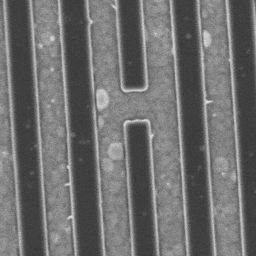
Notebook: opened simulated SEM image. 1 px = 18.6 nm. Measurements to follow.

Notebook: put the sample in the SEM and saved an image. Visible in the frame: parallel lines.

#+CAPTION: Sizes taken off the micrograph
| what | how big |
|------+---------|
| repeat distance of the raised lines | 55.6 px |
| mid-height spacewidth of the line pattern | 514 nm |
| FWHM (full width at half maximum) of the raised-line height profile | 27.6 px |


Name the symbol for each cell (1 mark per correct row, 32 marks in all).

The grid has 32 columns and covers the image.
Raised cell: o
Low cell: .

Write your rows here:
oooo...oooo...oooo...oooo...oooo
.ooo...oooo...oooo...oooo...oooo
.ooo....ooo....ooo....ooo....ooo
.ooo....ooo....ooo....ooo....ooo
.ooo....ooo....ooo....oooo...ooo
.ooo....ooo....ooo....oooo...ooo
.ooo....ooo....ooo....ooo....ooo
.ooo....ooo....ooo....ooo....ooo
.ooo....oooo...ooo....ooo....ooo
.ooo....oooo...ooo....ooo....ooo
.oooo...oooo...ooo....oooo...ooo
.oooo...oooo..........oooo...ooo
.oooo...ooooo.........oooo...ooo
.oooo...oooo..........oooo...ooo
.oooo...oooo..........oooo...ooo
.oooo...oooo....ooo...oooo...ooo
.oooo...oooo....ooo...oooo...ooo
..ooo....ooo....ooo....ooo....oo
..ooo....ooo..ooooo....ooo....oo
..ooo....ooo..o.ooo....ooo....oo
..ooo....ooo....ooo....ooo.o..oo
..ooo....ooo....ooo....ooo....oo
..ooo....ooo....ooo....ooo....oo
..ooo....oooo...ooo....ooo....oo
..ooo....oooo...ooo....ooo....oo
..oooo...oooo...ooo....oooo...oo
..oooo...oooo...ooo....oooo...oo
..oooo...oooo...oooo...oooo...oo
..oooo...oooo...oooo...oooo...oo
..oooo...oooo...oooo...oooo...oo
..oooo...oooo...oooo...oooo...oo
...ooo...oooo....ooo...oooo...oo